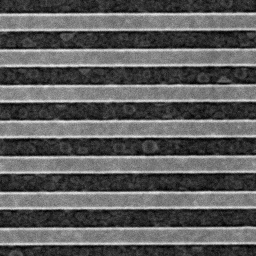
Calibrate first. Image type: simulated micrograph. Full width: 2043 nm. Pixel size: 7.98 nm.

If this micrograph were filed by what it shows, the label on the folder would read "parallel lines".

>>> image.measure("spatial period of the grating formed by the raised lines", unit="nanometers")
285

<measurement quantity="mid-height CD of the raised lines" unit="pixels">16.9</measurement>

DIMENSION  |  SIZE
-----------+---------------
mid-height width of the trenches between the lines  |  154 nm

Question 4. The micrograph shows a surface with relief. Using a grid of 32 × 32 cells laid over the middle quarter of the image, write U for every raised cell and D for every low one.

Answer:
UUUUUUUUUUUUDDDDDDDDDDDDDDDDDDDD
DDDDDDDDDDDDDDDDDDDDDDDDDDDDDDDD
DDDDDDDDDDDDDDDDDDDDDDDDDDDDDDDD
DDDDDDDDDDDDDDDDDDDDDDDDDDDDDDDD
DDDDDDDDDDDDDDDDDDDDDDDDDDDDDDDD
UUUUUUUUUUUUUUUUUUUUUUUUUUDUUUUU
UUUUUUUUUUUUUUUUUUUUUUUUUUUUUUUU
UUUUUUUUUUUUUUUUUUUUUUUUUUUUUUUU
UUUUUUUUUUUUUUUUUUUUUUUUUUUUUUUU
DDDDDDDDDDDDDDDDDDDDDDDDDDDDDDDD
DDDDDDDDDDDDDDDDDDDDDDDDDDDDDDDD
DDDDDDDDDDDDDDDDDDDDDDDDDDDDDDDD
DDDDDDDDDDDDDDDDDDDDDDDDDDDDDDDD
DDDDDDDDDDDDDDDDDDDDDDDDDDDDDDDD
UUUUUUUUUUUUUUUUUUUUUUUUUUUUUUUU
UUUUUUUUUUUUUUUUUUUUUUUUUUUUUUUU
UUUUUUUUUUUUUUUUUUUUUUUUUUUUUUUU
UUUUUUUUUUUUUUUUUUUUUUUUUUUUUUUU
DDDDDDDDDDDDDDDDDDDDDDDDDDDDDDDD
DDDDDDDDDDDDDDDDDDDDDDDDDDDDDDDD
DDDDDDDDDDDDDDDDDDDDDDDDDDDDDDDD
DDDDDDDDDDDDDDDDDDDDDDDDDDDDDDDD
DDDDDDDDDDDDDDDDDDDDDDDDDDDDDDDD
UUUUUUUUUUUUUUUUUUUUUUUUUUUUUUUU
UUUUUUUUUUUUUUUUUUUUUUUUUUUUUUUU
UUUUUUUUUUUUUUUUUUUUUUUUUUUUUUUU
UUUUUUUUUUUUUUUUUUUUUUUUUUUUUUUU
DDDDDDDDDDDDDDDDDDDDDDDDDDDDDDDD
DDDDDDDDDDDDDDDDDDDDDDDDDDDDDDDD
DDDDDDDDDDDDDDDDDDDDDDDDDDDDDDDD
DDDDDDDDDDDDDDDDDDDDDDDDDDDDDDDD
DDDDDDDDDDDDDDDDDDDDDDDDDDDDDDDD